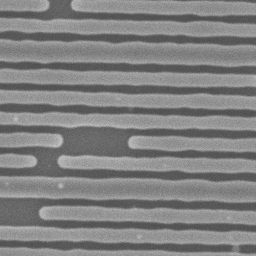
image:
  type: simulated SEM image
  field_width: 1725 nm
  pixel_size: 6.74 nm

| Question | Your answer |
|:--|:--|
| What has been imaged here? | groups of lines, slits or small figures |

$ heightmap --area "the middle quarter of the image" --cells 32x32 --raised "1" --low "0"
00000000000000000000000000000000
00000000000000000000000000000000
11111111111111111111110111110000
11111111111111111111111111111111
11111111111111111111111111111111
00000000000000000000000000000000
00000000000000000000000000000000
11111111111111100000000000000000
11111111111111111111111111111111
11111111111111111111111111111111
00000000000001111111111111111111
00000000000000000000000000000000
11100000000000000000000000000000
11111111111111111111111111111111
11111111111111111111111111111111
11110001111111111111111111111111
00000000000000000000000000000000
00000000000000000000000000000000
00000000000000000111111111111110
00000000000000001111111111111111
00000000000000001111111111111111
00000000000000000000000001111100
00000000000000000000000000000000
11111111111100110000000011110000
11111111111111111111111111111111
11111111111111111111111111111111
00000000000000001101111111111111
00000000000000000000000000000000
00000000000000000000000000000000
11111111111111111111111111111111
11111111111111111111111111111111
11111111111111111111111111111111